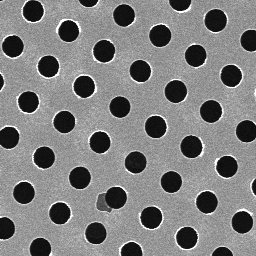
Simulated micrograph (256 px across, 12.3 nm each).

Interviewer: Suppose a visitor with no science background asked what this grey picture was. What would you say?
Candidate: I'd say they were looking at a regular array of holes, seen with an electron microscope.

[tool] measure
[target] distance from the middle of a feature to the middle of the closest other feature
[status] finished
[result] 498 nanometers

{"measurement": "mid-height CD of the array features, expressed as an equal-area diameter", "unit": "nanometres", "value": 270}